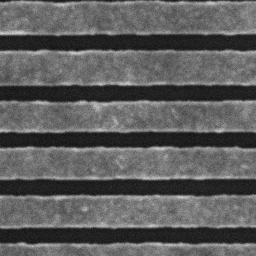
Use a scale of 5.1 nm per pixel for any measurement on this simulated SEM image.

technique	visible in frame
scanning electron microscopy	lines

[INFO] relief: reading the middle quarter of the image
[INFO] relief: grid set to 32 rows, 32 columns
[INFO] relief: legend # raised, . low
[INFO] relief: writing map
################################
################################
################################
################################
################################
................................
................................
................................
................................
....##............###...#...#..#
################################
################################
################################
################################
################################
################################
################################
................................
................................
................................
................................
################################
################################
################################
################################
################################
################################
################################
################################
................................
................................
................................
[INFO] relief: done